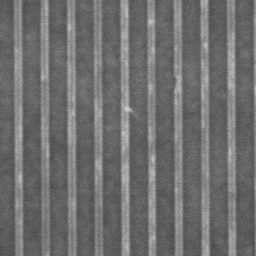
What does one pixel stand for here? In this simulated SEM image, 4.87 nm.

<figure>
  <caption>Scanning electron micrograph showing parallel lines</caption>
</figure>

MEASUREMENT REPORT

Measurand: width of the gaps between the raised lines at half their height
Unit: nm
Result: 102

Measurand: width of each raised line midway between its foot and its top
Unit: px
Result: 6.12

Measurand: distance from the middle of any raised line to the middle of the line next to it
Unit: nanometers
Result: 130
